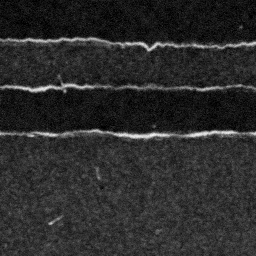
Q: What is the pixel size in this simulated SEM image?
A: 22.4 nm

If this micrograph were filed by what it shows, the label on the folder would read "one or a few lines or trenches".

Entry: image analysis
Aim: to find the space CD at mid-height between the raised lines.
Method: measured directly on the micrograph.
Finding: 0.981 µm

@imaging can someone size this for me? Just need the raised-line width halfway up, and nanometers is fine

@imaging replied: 1050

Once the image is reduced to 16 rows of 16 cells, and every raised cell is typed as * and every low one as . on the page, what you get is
****************
****************
****..**********
................
................
*..*******.*..**
****************
****************
........*.......
................
................
................
................
................
................
................